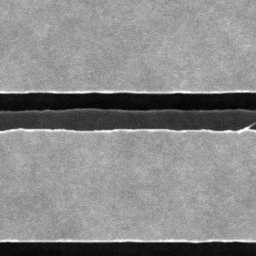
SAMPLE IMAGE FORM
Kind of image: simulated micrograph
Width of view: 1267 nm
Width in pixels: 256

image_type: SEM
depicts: lines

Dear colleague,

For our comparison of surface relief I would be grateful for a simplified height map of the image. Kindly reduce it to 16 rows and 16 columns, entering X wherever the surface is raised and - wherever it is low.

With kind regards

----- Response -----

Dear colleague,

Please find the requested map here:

XXXXXXXXXXXXXXXX
XXXXXXXXXXXXXXXX
XXXXXXXXXXXXXXXX
XXXXXXXXXXXXXXXX
XXXXXXXXXXXXXXXX
XXXXXXXXXXXXXXXX
----------------
----------------
XXXXXXXXXXXXXXXX
XXXXXXXXXXXXXXXX
XXXXXXXXXXXXXXXX
XXXXXXXXXXXXXXXX
XXXXXXXXXXXXXXXX
XXXXXXXXXXXXXXXX
XXXXXXXXXXXXXXXX
----------------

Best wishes